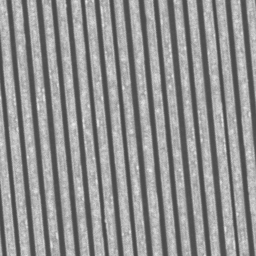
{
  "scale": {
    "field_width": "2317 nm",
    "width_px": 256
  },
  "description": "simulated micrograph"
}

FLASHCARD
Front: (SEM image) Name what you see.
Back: parallel lines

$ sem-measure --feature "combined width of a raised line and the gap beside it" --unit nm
132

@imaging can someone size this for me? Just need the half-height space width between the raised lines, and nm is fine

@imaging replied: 45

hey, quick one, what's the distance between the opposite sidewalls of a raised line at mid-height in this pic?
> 0.0913 microns